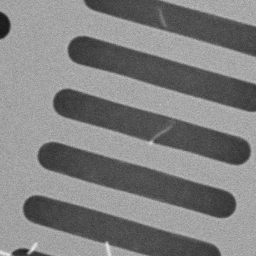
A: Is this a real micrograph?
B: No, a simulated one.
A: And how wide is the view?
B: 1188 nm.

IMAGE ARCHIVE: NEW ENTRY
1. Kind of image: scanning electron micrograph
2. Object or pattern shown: groups of lines, slits or small figures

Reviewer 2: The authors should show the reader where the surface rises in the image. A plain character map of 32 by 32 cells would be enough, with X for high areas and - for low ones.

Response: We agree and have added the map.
XXXXXXXXXXX-----------XXXXXXXXXX
XXXXXXXXXXXX--------------XXXXXX
-XXXXXXXXXXXXXXX-------------XXX
-XXXXXXXXXXXXXXXXXX-------------
-XXXXXXXXX-XXXXXXXXXXXX---------
XXXXXXXXX-----XXXXXXXXXXXX------
XXXXXXXXX---------XXXXXXXXXXXX--
XXXXXXXXX------------XXXXXXXXXXX
XXXXXXXXXXXX-------------XXXXXXX
XXXXXXXXXXXXXXX--------------XXX
XXXXXXXXXXXXXXXXXXX-------------
XXXXXXX---XXXXXXXXXXXX----------
XXXXXXX-------XXXXXXXXXXXX------
XXXXXXX----------XXXXXXXXXXXX---
XXXXXXXX-------------XXXXXXXXXXX
XXXXXXXXXXX-------------XXXXXXXX
XXXXXXXXXXXXXXX-------------XXXX
XXXXXXXXXXXXXXXXXX-------------X
XXXXX-----XXXXXXXXXXX----------X
XXXXX--------XXXXXXXXXXXX------X
XXXXX------------XXXXXXXXXXXX-XX
XXXXXXX-------------XXXXXXXXXXXX
XXXXXXXXXX-------------XXXXXXXXX
XXXXXXXXXXXXX--------------XXXXX
XXXX-XXXXXXXXXXXX------------XXX
XXX------XXXXXXXXXXXX---------XX
XXX----------XXXXXXXXXXX-----XXX
XXXX------------XXXXXXXXXXXXXXXX
XXXXXX--------------XXXXXXXXXXXX
XXXXXXXXX--------------XXXXXXXXX
XXXXXXXXXXXXX--------------XXXXX
XX---XXXXXXXXXXXX----------XXXXX